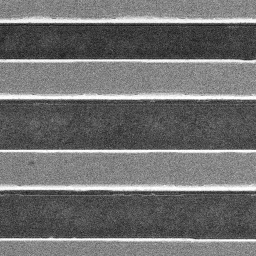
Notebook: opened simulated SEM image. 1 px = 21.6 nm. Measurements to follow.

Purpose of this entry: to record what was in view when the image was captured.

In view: lines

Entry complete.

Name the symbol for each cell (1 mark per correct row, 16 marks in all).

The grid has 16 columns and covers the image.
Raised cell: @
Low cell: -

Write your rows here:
@@@@@@@@@@@@@@@@
----------------
----------------
----------------
@@@@@@@@@@@@@@@@
@@@@@@@@@@@@@@@@
----------------
----------------
----------------
@@@@@@@@@@@@@@@@
@@@@@@@@@@@@@@@@
@@@@@@@@@@@@@@@@
----------------
----------------
----------------
@@@@@@@@@@@@@@@@